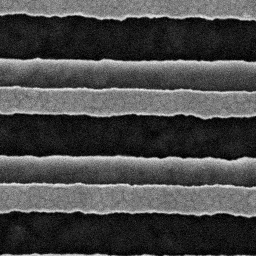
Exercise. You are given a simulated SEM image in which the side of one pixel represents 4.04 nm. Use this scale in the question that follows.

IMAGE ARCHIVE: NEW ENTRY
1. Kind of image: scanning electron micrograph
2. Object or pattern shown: lines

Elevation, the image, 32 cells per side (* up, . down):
********************************
********************************
................................
................................
................................
................................
................................
**********...*........*.........
********************************
********************************
********************************
********************************
********************************
********************************
............*...........********
................................
................................
................................
................................
*..*..**......*.................
********************************
********************************
********************************
********************************
********************************
********************************
*.......*.**********************
................................
................................
................................
................................
................................